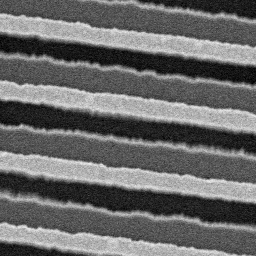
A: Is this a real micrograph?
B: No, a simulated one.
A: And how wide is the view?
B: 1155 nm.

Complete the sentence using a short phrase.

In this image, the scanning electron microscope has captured lines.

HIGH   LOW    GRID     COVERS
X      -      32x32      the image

XXXXXXXXXXXXXXXXX---------------
XXXXXXXXXXXXXXXXXXXXXXXX--------
XXXXXXXXXXXXXXXXXXXXXXXXXXXXXXX-
XXXXXXXXXXXXXXXXXXXXXXXXXXXXXXXX
-----XXXXXXXXXXXXXXXXXXXXXXXXXXX
------------XXXXXXXXXXXXXXXXXXXX
-------------------XXXXXXXXXXXXX
XXXXXXX--------------------XXXXX
XXXXXXXXXXXXXXX-----------------
XXXXXXXXXXXXXXXXXXXX------------
XXXXXXXXXXXXXXXXXXXXXXXXXXXXX---
XXXXXXXXXXXXXXXXXXXXXXXXXXXXXXXX
--XXXXXXXXXXXXXXXXXXXXXXXXXXXXXX
----------XXXXXXXXXXXXXXXXXXXXXX
-----------------XXXXXXXXXXXXXXX
-------------------------XXXXXXX
XXXXXXXX------------------------
XXXXXXXXXXXXXXX-----------------
XXXXXXXXXXXXXXXXXXXXXXX---------
XXXXXXXXXXXXXXXXXXXXXXXXXXXXXXX-
XXXXXXXXXXXXXXXXXXXXXXXXXXXXXXXX
---XXXXXXXXXXXXXXXXXXXXXXXXXXXXX
----------XXXXXXXXXXXXXXXXXXXXXX
------------------XXXXXXXXXXXXXX
X------------------------XXXXXXX
XXXXXXX-------------------------
XXXXXXXXXXXXXX------------------
XXXXXXXXXXXXXXXXXXXXXXXX--------
XXXXXXXXXXXXXXXXXXXXXXXXXXXXXXX-
XXXXXXXXXXXXXXXXXXXXXXXXXXXXXXXX
----XXXXXXXXXXXXXXXXXXXXXXXXXXXX
-----------XXXXXXXXXXXXXXXXXXXXX